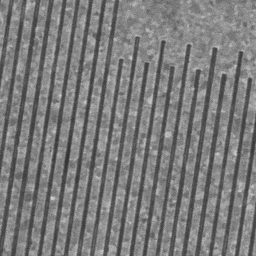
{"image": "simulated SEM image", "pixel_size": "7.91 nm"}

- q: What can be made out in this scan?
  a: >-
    parallel lines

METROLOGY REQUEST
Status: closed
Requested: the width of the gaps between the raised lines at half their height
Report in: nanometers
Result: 44.1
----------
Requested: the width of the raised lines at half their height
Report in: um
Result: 0.0587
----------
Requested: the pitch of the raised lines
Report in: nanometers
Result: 103